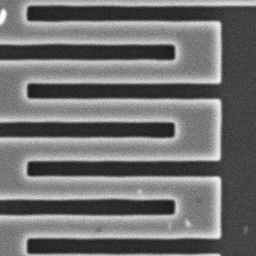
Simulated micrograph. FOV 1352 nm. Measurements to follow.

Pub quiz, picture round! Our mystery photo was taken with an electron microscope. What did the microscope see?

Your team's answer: groups of lines, slits or small figures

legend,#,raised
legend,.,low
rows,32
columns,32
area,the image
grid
################################
###.............................
####............................
############################....
############################....
.....................#######....
......................######....
......................######....
############################....
############################....
####............................
###.............................
###########################.....
############################....
############################....
......................######....
......................######....
############################....
############################....
############################....
###.............................
###.............................
############################....
############################....
############################....
......................######....
......................######....
############################....
############################....
###########################.....
###.............................
####............................